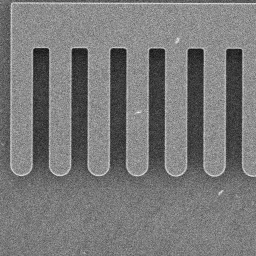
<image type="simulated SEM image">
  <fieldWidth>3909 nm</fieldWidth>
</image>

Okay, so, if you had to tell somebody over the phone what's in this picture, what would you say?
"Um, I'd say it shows groups of lines, slits or small figures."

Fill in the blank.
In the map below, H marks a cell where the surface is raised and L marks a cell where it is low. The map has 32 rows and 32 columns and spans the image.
LLHHHHHHHHHHHHHHHHHHHHHLLLLLLLLL
LHHHHHHHHHHHHHHHHHHHHHHHHHHHHHHH
LHHHHHHHHHHHHHHHHHHHHHHHHHHHHHHH
LHHHHHHHHHHHHHHHHHHHHHHHHHHHHHHH
LHHHHHHHHHHHHHHHHHHHHHHHHHHHHHHH
LHHHHHHHHHHHHHHHHHHHHHHHHHHHHHHH
LHHHLLHHHLLHHHLLHHHLLHHLLHHHLLHH
LHHHLLHHHLLHHHLLHHHLLHHLLHHHLLHH
LHHHLLHHHLLHHHLLHHHLLHHLLHHHLLHH
LHHHLLHHHLLHHHLLHHLLLHHLLHHHLLHH
LHHHLLHHHLLHHHLLHHLLLHHLLHHHLLHH
LHHHLLHHHLLHHHLLHHLLLHHLLHHHLLHH
LHHHLLHHHLLHHHLLHHLLLHHLLHHHLLHH
LHHHLLHHHLLHHHLLHHLLLHHLLHHHLLHH
LHHHLLHHHLLHHHLLHHLLLHHLLHHHLLHH
LHHHLLHHHLLHHHLLHHLLLHHLLHHHLLHH
LHHHLLHHHLLHHHLLHHLLLHHLLHHHLLHH
LHHHLLHHHLLHHHLLHHLLLHHLLHHHLLHH
LHHHLLHHHLLHHHLLHHLLLHHLLHHHLLHH
LHHHLLHHHLLHHHLLHHLLLHHLLHHHLLHH
LHHHLLHHHLLHHHLLHHLLLHHLLHHHLLHH
LLHHLLLHHLLHHLLLHHLLLHHLLLHHLLLH
LLLLLLLLLLLLLLLLLLLLLLLLLLLLLLLL
LLLLLLLLLLLLLLLLLLLLLLLLLLLLLLLL
LLLLLLLLLLLLLLLLLLLLLLLLLLLLLLLL
LLLLLLLLLLLLLLLLLLLLLLLLLLLLLLLL
LLLLLLLLLLLLLLLLLLLLLLLLLLLLLLLL
LLLLLLLLLLLLLLLLLLLLLLLLLLLLLLLL
LLLLLLLLLLLLLLLLLLLLLLLLLLLLLLLL
LLLLLLLLLLLLLLLLLLLLLLLLLLLLLLLL
LLLLLLLLLLLLLLLLLLLLLLLLLLLLLLLL
LLLLLLLLLLLLLLLLLLLLLLLLLLLLLLLL